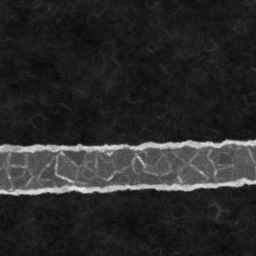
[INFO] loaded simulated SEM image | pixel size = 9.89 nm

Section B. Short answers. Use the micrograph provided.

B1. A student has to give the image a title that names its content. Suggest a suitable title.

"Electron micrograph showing one or a few lines or trenches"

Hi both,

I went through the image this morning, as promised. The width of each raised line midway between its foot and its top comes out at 0.412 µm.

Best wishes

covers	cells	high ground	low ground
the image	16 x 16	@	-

----------------
----------------
----------------
----------------
----------------
----------------
----------------
----------------
----------------
@@@@@@@@@@@@@@@@
@@@@@@@@@@@@@@@@
@@@@@@@@@@@@@@@-
----------------
----------------
----------------
----------------